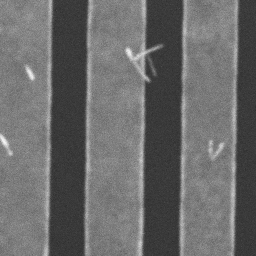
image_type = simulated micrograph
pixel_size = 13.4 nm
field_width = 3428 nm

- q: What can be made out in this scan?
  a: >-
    wiring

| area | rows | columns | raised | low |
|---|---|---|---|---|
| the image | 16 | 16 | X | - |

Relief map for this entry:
XXX---XXX---XXX-
XXX---XXX--XXXX-
XXX---XXX--XXXX-
XXX---XXX--XXXX-
XXX---XXX--XXXX-
XXX---XXX--XXXX-
XXX--XXXX--XXXX-
XXX--XXXX--XXXX-
XXX--XXXX--XXXX-
XXX--XXXX--XXXX-
XXX--XXXX--XXXX-
XXX--XXXX--XXXX-
XXX--XXXX--XXXX-
XXX--XXXX--XXXX-
XXX--XXXX--XXXX-
XXX--XXXX--XXXX-